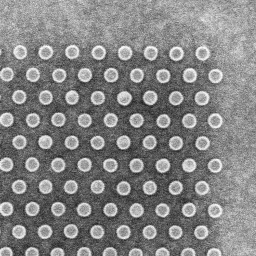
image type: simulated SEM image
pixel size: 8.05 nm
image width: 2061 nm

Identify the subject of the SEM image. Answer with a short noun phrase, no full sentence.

a regular array of raised bodies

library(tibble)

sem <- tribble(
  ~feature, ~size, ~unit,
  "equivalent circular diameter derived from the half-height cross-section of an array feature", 105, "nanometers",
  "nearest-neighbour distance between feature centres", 205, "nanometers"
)